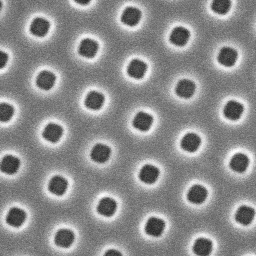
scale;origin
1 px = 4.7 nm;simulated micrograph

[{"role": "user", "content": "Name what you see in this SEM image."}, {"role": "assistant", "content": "a regular array of holes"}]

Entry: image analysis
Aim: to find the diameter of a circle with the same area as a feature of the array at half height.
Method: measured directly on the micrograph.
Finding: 0.103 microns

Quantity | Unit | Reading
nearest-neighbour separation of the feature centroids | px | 52.3